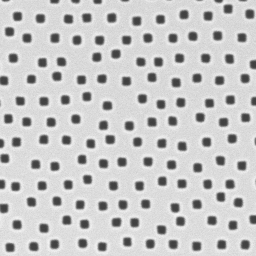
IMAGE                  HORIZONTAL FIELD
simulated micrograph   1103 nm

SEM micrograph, a regular array of holes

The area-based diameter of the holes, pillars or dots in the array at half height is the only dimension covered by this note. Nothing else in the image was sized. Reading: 41.3 nm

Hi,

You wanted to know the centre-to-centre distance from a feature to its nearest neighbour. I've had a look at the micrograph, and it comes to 84.5 nm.